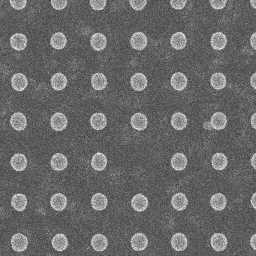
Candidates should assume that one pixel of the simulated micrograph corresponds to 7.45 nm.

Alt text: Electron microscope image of a regular array of raised bodies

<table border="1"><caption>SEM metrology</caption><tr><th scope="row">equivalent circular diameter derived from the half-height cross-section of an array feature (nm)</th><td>125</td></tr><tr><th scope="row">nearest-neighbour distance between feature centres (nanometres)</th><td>295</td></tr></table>